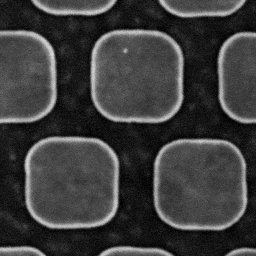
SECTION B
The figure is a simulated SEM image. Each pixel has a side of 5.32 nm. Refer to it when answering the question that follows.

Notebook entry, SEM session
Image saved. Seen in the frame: raised bodies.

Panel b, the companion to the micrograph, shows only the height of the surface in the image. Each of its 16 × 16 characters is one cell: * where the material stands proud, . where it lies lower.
...****...*****.
................
***...*****...**
***...*****...**
***...*****...**
***...*****...**
***...*****...**
**.....***.....*
................
..*****...*****.
..*****...*****.
..*****...*****.
..*****...*****.
..*****...*****.
................
................